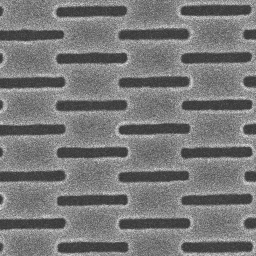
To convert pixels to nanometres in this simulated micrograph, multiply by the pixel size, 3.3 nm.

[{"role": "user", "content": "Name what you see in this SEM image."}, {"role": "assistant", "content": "a regular array of holes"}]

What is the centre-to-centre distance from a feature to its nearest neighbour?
156 nm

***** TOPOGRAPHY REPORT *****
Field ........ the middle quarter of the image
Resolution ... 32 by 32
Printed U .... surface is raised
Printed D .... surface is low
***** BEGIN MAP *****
UUUUUUUUUUUUUUUUUUUUUUUUUUUUUUUU
UUUUUUUUUUUUUUUUUUUUUUUUUUUUUUUU
UUUUUUUUUUUUUUUUUUUUUUUUUUUUUUUU
UUUUUUUUUUUUUUDDDDDDDDDDDDDDDDDU
UUUUUUUUUUUUUUDDDDDDDDDDDDDDDDDU
UUUUUUUUUUUUUUDDDDDDDDDDDDDDDDDU
UUUUUUUUUUUUUUUUUUUUUUUUUUUUUUUU
UUUUUUUUUUUUUUUUUUUUUUUUUUUUUUUU
UUUUUUUUUUUUUUUUUUUUUUUUUUUUUUUU
DDDDDDDDDDDDDDDDUUUUUUUUUUUUUUDD
DDDDDDDDDDDDDDDDUUUUUUUUUUUUUDDD
DDDDDDDDDDDDDDDUUUUUUUUUUUUUUUDD
UUUUUUUUUUUUUUUUUUUUUUUUUUUUUUUU
UUUUUUUUUUUUUUUUUUUUUUUUUUUUUUUU
UUUUUUUUUUUUUUUUUUUUUUUUUUUUUUUU
UUUUUUUUUUUUUUDDDDDDDDDDDDDDDDDU
UUUUUUUUUUUUUUDDDDDDDDDDDDDDDDDU
UUUUUUUUUUUUUUDDDDDDDDUUUUUUUUUU
UUUUUUUUUUUUUUUUUUUUUUUUUUUUUUUU
UUUUUUUUUUUUUUUUUUUUUUUUUUUUUUUU
UUUUUUUUUUUUUUUUUUUUUUUUUUUUUUUU
DDDDDDDDDDDDDDDDUUUUUUUUUUUUUDDD
DDDDDDDDDDDDDDDDUUUUUUUUUUUUUDDD
DUDDDDDDUUUUUUUUUUUUUUUUUUUUUUDD
UUUUUUUUUUUUUUUUUUUUUUUUUUUUUUUU
UUUUUUUUUUUUUUUUUUUUUUUUUUUUUUUU
UUUUUUUUUUUUUUUUUUUUUUUUUUUUUUUU
UUUUUUUUUUUUUUDDDDDDDDDDDDDDDDDU
UUUUUUUUUUUUUUDDDDDDDDDDDDDDDDDU
UUUUUUUUUUUUUUDDDDDDDDDDDDUUUUUU
UUUUUUUUUUUUUUUUUUUUUUUUUUUUUUUU
UUUUUUUUUUUUUUUUUUUUUUUUUUUUUUUU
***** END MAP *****